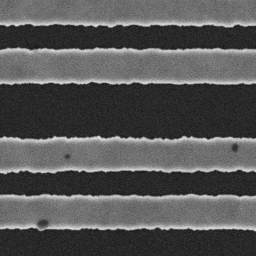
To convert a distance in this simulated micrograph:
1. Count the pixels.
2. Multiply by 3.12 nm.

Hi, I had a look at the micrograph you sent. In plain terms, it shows lines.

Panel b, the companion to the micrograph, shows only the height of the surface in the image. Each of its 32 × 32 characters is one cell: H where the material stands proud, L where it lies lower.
HHHHHHHHHHHHHHHHHHHHHHHHHHHHHHHH
HHHHHHHHHHHHHHHHHHHHHHHHHHHHHHHH
HHHHHHHHHHHHHHHHHHHHHHHHHHHHHHHH
LLLLLLLLLLLLLLLLLLLLLLLLLLLLLLLL
LLLLLLLLLLLLLLLLLLLLLLLLLLLLLLLL
LLLLLLLLLLLLLLLLLLLLLLLLLLLLLLLL
HHHHHHHHHHHHHHHHHHHHHHHHHHHHHHHH
HHHHHHHHHHHHHHHHHHHHHHHHHHHHHHHH
HHHHHHHHHHHHHHHHHHHHHHHHHHHHHHHH
HHHHHHHHHHHHHHHHHHHHHHHHHHHHHHHH
LLLLLLLLLLLLLLLLLLLLLLLLLLLLHLLL
LLLLLLLLLLLLLLLLLLLLLLLLLLLLLLLL
LLLLLLLLLLLLLLLLLLLLLLLLLLLLLLLL
LLLLLLLLLLLLLLLLLLLLLLLLLLLLLLLL
LLLLLLLLLLLLLLLLLLLLLLLLLLLLLLLL
LLLLLLLLLLLLLLLLLLLLLLLLLLLLLLLL
LLLLLLLLLLLLLLLLLLLLLLLLLLLLLLLL
HHHHHHHHHHHHHHHHHHHHHHHHHHHHHHHH
HHHHHHHHHHHHHHHHHHHHHHHHHHHHHHHH
HHHHHHHHHHHHHHHHHHHHHHHHHHHHHHHH
HHHHHHHHHHHHHHHHHHHHHHHHHHHHHHHH
HLLLHHHLLLLLLLLLLLLLLLLHLLLLLLLL
LLLLLLLLLLLLLLLLLLLLLLLLLLLLLLLL
LLLLLLLLLLLLLLLLLLLLLLLLLLLLLLLL
HHHHLHHLLHHHLLHLHLLLLHHHHHLHHHLL
HHHHHHHHHHHHHHHHHHHHHHHHHHHHHHHH
HHHHHHHHHHHHHHHHHHHHHHHHHHHHHHHH
HHHHHHHHHHHHHHHHHHHHHHHHHHHHHHHH
HHHHHHHHHHHHHHHHHHHLHHHHHHHHHHHH
LLLLLLLLLLLLLLLLLLLLLLLLLLLLLLLL
LLLLLLLLLLLLLLLLLLLLLLLLLLLLLLLL
LLLLLLLLLLLLLLLLLLLLLLLLLLLLLLLL